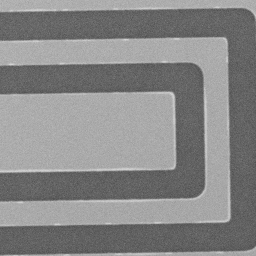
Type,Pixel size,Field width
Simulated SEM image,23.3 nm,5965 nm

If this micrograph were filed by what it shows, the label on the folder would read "groups of lines, slits or small figures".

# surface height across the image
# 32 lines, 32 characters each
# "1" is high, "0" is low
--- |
11111111111111111111111111111111
00000000000000000000000000000001
00000000000000000000000000000000
00000000000000000000000000000000
00000000000000000000000000000000
11111111111111111111111111110000
11111111111111111111111111110000
11111111111111111111111111110000
00000000000000000000000001110000
00000000000000000000000001110000
00000000000000000000000000111000
00000000000000000000000000111000
11111111111111111111110000111000
11111111111111111111110000111000
11111111111111111111110000111000
11111111111111111111110000111000
11111111111111111111110000111000
11111111111111111111110000111000
11111111111111111111110000111000
11111111111111111111110000111000
11111111111111111111110000111000
00000000000000000000000000111000
00000000000000000000000000111000
00000000000000000000000000111000
00000000000000000000000001111000
11111111111111111111111111111000
11111111111111111111111111111000
11111111111111111111111111110000
00000000000000000000000000000000
00000000000000000000000000000000
00000000000000000000000000000000
00000000000000000000000000000011